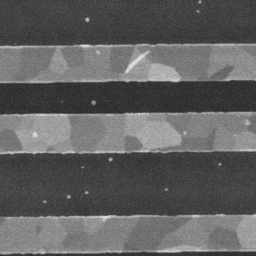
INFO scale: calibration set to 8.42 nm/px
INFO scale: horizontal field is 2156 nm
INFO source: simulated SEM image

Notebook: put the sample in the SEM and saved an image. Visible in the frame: lines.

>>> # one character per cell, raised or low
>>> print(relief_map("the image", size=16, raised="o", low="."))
................
................
................
oooooooooooooooo
oooooooooooooooo
................
................
oooooooooooooooo
oooooooooooooooo
oooooooo.o......
................
................
................
......o.oo.ooooo
oooooooooooooooo
oooooooooooooooo